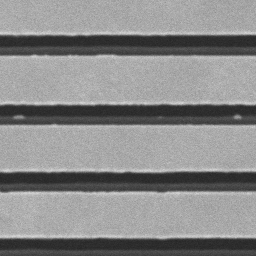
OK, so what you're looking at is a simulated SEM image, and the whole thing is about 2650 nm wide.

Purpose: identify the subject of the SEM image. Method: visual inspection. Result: lines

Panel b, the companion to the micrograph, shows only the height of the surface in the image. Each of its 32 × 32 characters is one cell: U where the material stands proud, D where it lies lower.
UUUUUUUUUUUUUUUUUUUUUUUUUUUUUUUU
UUUUUUUUUUUUUUUUUUUUUUUUUUUUUUUU
UUUUUUUUUUUUUUUUUUUUUUUUUUUUUUUU
UUUUUUUUUUUUUUUUUUUUUUUUUUUUUUUU
DDDDDDDDDDDDDDDDDDDDDDDDDDDDDDDD
DDDDDDDDDDDDDDDDDDDDDDDDDDDDDDDD
DDDDDDDDDDDDDDDDDDDDDDDDDDDDDDDD
UUUUUUUUUUUUUUUUUUUUUUUUUUUUUUUU
UUUUUUUUUUUUUUUUUUUUUUUUUUUUUUUU
UUUUUUUUUUUUUUUUUUUUUUUUUUUUUUUU
UUUUUUUUUUUUUUUUUUUUUUUUUUUUUUUU
UUUUUUUUUUUUUUUUUUUUUUUUUUUUUUUU
UUUUUUUUUUUUUUUUUUUUUUUUUUUUUUUU
DDDDDDDDDDDDDDDDDDDDDDDDDDDDDDDD
DDDDDDDDDDDDDDDDDDDDDDDDDDDDDDDD
DDDDDDDDDDDDDDDDDDDDDDDDDDDDDDDD
UUUUUUUUUUUUUUUUUUUUUUUUUUUUUUUU
UUUUUUUUUUUUUUUUUUUUUUUUUUUUUUUU
UUUUUUUUUUUUUUUUUUUUUUUUUUUUUUUU
UUUUUUUUUUUUUUUUUUUUUUUUUUUUUUUU
UUUUUUUUUUUUUUUUUUUUUUUUUUUUUUUU
DDDDDDDDDDDDDDDDDDDDDDDDDDDDDDDD
DDDDDDDDDDDDDDDDDDDDDDDDDDDDDDDD
DDDDDDDDDDDDDDDDDDDDDDDDDDDDDDDD
UUUUUUUUUUUUUUUUUUUUUUUUUUUUUUUU
UUUUUUUUUUUUUUUUUUUUUUUUUUUUUUUU
UUUUUUUUUUUUUUUUUUUUUUUUUUUUUUUU
UUUUUUUUUUUUUUUUUUUUUUUUUUUUUUUU
UUUUUUUUUUUUUUUUUUUUUUUUUUUUUUUU
UUUUUUUUUUUUUUUUUUUUUUUUUUUUUUUU
DDDDDDDDDDDDDDDDDDDDDDDDDDDDDDDD
DDDDDDDDDDDDDDDDDDDDDDDDDDDDDDDD